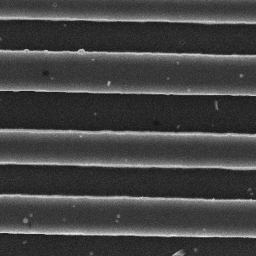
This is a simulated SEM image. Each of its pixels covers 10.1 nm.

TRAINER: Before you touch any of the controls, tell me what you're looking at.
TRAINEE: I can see lines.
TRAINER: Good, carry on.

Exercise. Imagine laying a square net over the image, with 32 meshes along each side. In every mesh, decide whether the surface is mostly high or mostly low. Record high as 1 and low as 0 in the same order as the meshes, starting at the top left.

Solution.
11111111111111111111111111111111
11111111111111111111111111111111
00000000000111111111111111111111
00000000000000000000000000000000
00000000000000000000000000000000
00000000000000000000000000000000
11111111111000000000000000000000
11111111111111111111111111111111
11111111111111111111111111111111
11111111111111111111111111111111
11111111111111111111111111111111
00000000001111111111111111111111
00000000000000000000000000000000
00000000000000000000000000000000
00000000000000000000000000000000
00000000000000000000000000000000
11111111110000000000000000000000
11111111111111111111111111111111
11111111111111111111111111111111
11111111111111111111111111111111
00000000011111111111111111111111
00000000000000000000000000000000
00000000000000000000000000000000
00000000000000000000000000000000
11110000000000000000000000000000
11111111111111111111111111111111
11111111111111111111111111111111
11111111111111111111111111111111
11111111111111111111111111111111
00000000000000000000000011111111
00000000000000000000000000000000
00000000000000000000000000000000